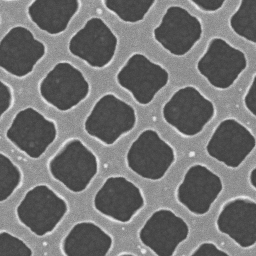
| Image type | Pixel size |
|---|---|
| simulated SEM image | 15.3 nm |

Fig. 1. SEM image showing a regular array of holes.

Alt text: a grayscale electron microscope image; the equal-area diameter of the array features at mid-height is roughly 696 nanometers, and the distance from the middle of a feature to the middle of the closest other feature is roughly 831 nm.